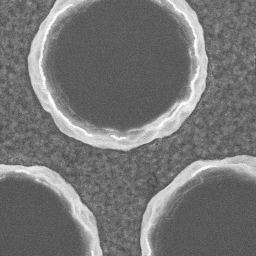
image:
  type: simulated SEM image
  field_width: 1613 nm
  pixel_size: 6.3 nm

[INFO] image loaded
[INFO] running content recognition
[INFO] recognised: raised bodies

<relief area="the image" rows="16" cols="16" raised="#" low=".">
....#######.....
...#########....
..###########...
..###########...
..###########...
...#########....
...#########....
....#######.....
.....#####......
................
#............###
####.......#####
#####.....######
#####....#######
######...#######
######...#######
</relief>